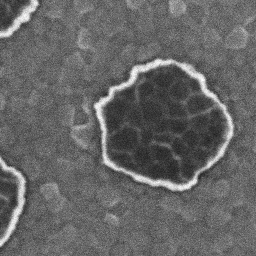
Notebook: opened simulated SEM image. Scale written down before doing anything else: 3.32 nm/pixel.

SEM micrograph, raised bodies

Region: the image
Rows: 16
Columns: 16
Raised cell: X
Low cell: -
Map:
XX--------------
X---------------
----------------
----------------
---------XXX----
-------XXXXXX---
------XXXXXXXX--
------XXXXXXXX--
------XXXXXXXX--
------XXXXXXXX--
X------XXXXXX---
X---------XX----
X---------------
X---------------
X---------------
----------------